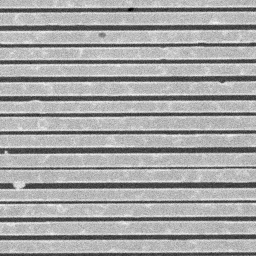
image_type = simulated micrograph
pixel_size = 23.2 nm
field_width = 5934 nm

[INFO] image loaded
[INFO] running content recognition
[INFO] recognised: parallel lines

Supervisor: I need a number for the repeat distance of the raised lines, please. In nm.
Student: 406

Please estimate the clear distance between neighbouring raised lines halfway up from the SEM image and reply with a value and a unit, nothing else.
128 nm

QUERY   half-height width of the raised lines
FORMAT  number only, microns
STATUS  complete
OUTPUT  0.284